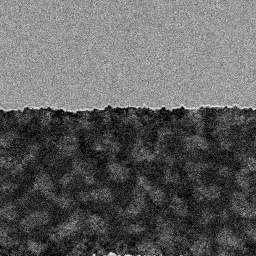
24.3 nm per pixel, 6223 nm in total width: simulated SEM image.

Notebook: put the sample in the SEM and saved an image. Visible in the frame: one or a few lines or trenches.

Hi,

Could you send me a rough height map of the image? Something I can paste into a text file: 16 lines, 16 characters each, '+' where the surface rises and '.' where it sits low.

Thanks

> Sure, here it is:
++++++++++++++++
++++++++++++++++
++++++++++++++++
++++++++++++++++
++++++++++++++++
++++++++++++++++
++++++++++++++++
................
................
................
................
................
................
................
................
................